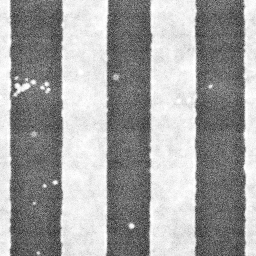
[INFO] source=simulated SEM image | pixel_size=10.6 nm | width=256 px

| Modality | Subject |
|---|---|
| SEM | lines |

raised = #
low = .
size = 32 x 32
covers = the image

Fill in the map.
#.......#####......#####.......#
#.......#####......#####.......#
#.......#####......#####.......#
#.......#####......#####.......#
#.......#####......#####.......#
#.......#####......#####.......#
#.......#####......#####.......#
#.......#####......#####.......#
#.......#####......#####.......#
#.......#####......#####.......#
#.......#####......#####.......#
#.......#####......#####.......#
#.......#####......#####.......#
#.......#####......#####.......#
#.......#####......#####.......#
#.......#####......#####.......#
#.......#####......#####.......#
#.......#####......#####.......#
#.......#####......#####.......#
#.......#####......#####.......#
#.......#####......#####.......#
#.......#####......#####.......#
#.......#####......#####.......#
#.......#####......#####.......#
#.......#####......#####.......#
#.......#####......#####.......#
#.......#####......#####.......#
#.......#####......#####.......#
#.......#####......#####.......#
#.......#####......#####.......#
#.......#####......#####.......#
#.......#####......#####.......#